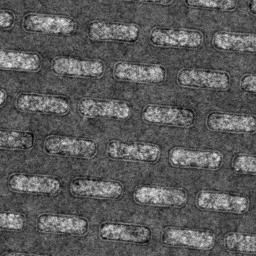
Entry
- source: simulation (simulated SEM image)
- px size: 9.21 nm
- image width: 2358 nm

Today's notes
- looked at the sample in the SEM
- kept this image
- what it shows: a regular array of holes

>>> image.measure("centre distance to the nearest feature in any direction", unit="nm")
456